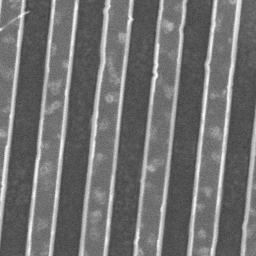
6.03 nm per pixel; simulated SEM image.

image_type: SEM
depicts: parallel lines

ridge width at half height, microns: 0.148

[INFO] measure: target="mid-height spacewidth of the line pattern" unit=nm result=174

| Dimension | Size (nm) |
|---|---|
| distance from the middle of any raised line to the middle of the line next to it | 323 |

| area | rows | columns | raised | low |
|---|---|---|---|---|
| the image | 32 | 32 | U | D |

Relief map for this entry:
UUUDDDDUUUDDDUUUDDDDUUUDDDDUUUDD
UUUDDDDUUUDDDUUUDDDDUUUDDDDUUUDD
UUUDDDUUUDDDDUUUDDDDUUUDDDDUUUDD
UUUDDDUUUDDDDUUUDDDDUUUDDDDUUUDD
UUUDDDUUUDDDDUUUDDDDUUUDDDUUUUDD
UUDDDDUUUDDDDUUUDDDDUUUDDDUUUDDD
UUDDDDUUUDDDDUUUDDDUUUUDDDUUUDDD
UUDDDDUUUDDDDUUUDDDUUUDDDDUUUDDD
UUDDDDUUUDDDDUUUDDDUUUDDDDUUUDDD
UUDDDDUUUDDDUUUUDDDUUUDDDDUUUDDD
UUDDDDUUUDDDUUUDDDDUUUDDDDUUUDDD
UUDDDDUUDDDDUUUDDDDUUUDDDDUUUDDD
UUDDDUUUDDDDUUUDDDDUUUDDDUUUUDDD
UUDDDUUUDDDDUUUDDDDUUUDDDUUUUDDD
UUDDDUUUDDDDUUUDDDDUUUDDDUUUDDDD
UDDDDUUUDDDDUUUDDDDUUUDDDUUUDDDD
UDDDDUUUDDDDUUUDDDUUUUDDDUUUDDDD
UDDDDUUUDDDDUUUDDDUUUDDDDUUUDDDD
UDDDDUUUDDDUUUUDDDUUUDDDDUUUDDDD
UDDDDUUUDDDUUUDDDDUUUDDDDUUUDDDD
UDDDDUUUDDDUUUDDDDUUUDDDDUUUDDDD
UDDDUUUUDDDUUUDDDDUUUDDDDUUUDDDU
UDDDUUUDDDDUUUDDDDUUUDDDDUUUDDDU
UDDDUUUDDDDUUUDDDDUUUDDDUUUUDDDU
DDDDUUUDDDDUUUDDDDUUUDDDUUUDDDDU
DDDDUUUDDDDUUUDDDDUUUDDDUUUDDDDU
DDDDUUUDDDDUUUDDDUUUDDDDUUUDDDDU
DDDDUUUDDDUUUUDDDUUUDDDDUUUDDDDU
DDDDUUUDDDUUUUDDDUUUDDDDUUUDDDDU
DDDDUUUDDDUUUDDDDUUUDDDDUUUDDDUU
DDDDUUUDDDUUUDDDDUUUDDDDUUUDDDUU
DDDUUUDDDDUUUDDDDUUUDDDDUUUDDDUU